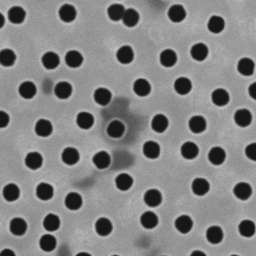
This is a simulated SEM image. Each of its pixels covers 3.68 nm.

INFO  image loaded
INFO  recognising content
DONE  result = a regular array of holes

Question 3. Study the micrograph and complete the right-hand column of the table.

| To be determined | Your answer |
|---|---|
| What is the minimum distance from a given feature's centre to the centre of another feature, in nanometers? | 115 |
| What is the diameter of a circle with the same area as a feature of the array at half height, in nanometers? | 61.7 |